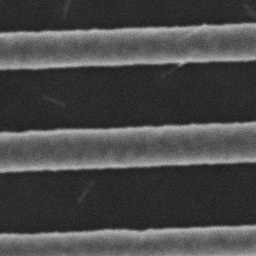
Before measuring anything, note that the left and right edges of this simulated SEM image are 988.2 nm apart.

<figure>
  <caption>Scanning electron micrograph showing lines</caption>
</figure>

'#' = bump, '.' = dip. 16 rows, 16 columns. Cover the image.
................
...............#
################
################
................
................
................
................
################
################
#######.........
................
................
................
.....###########
################